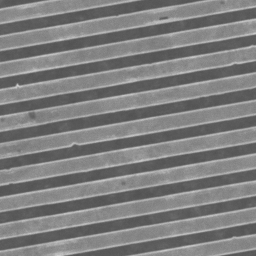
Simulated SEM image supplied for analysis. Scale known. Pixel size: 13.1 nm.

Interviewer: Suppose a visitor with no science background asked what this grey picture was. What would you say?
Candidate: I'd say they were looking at parallel lines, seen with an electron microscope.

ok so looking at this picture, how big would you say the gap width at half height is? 161 nanometres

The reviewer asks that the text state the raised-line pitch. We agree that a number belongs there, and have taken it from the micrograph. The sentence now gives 348 nanometres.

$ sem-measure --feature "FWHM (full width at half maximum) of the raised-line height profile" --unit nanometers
184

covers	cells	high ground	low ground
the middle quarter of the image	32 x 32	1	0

00000000000000000001111111111111
00000000000001111111111111111111
00000001111111111011111111100000
01111111111111111011110000000000
11111111111111110000000000000000
11111111111000000000000000000111
11110000000000000000000011111111
00000000000000000111111111111111
00000000000111111111111111111111
00000111111111111111111111100000
11111111111111111111100000000000
11111111111111100000000000000000
11111111000000000000000000001111
11000000000000000000001111111111
00000000000000001111111111111111
00000000000111111111111111111110
00000111111111111111111110000000
11111111111111111110000000000000
11111111111110000000000000000000
11111110000000000000000000111111
10000000000000000000111111111111
00000000000000011111111111111111
00000000011111111111111111111000
00011111111111111111111000000000
11111111111111111100000000000000
11111111111110000000000000000011
11111110000000000000000000111111
00000000000000000011111101111111
00000000000001111111111111111111
00000001111111111111111111110000
00111111111111111111110000000000
11111111111111110000000000000000